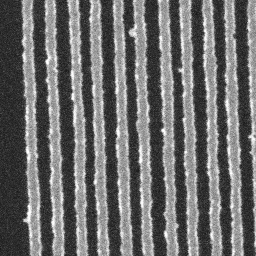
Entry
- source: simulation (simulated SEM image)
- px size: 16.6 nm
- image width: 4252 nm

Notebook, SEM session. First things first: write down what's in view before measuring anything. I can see parallel lines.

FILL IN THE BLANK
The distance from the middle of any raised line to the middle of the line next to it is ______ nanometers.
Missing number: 373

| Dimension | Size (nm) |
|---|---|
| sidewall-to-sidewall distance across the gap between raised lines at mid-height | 212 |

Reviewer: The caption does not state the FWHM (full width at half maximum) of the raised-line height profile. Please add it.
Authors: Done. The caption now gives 160 nm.